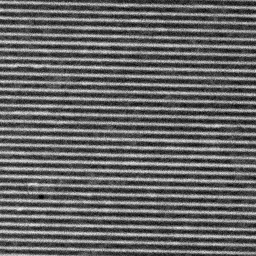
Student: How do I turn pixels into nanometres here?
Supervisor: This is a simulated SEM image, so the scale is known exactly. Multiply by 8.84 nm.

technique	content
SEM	parallel lines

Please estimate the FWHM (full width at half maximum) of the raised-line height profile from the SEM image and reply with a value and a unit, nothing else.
17.7 nanometres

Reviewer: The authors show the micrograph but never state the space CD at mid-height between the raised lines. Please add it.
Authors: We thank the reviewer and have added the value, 53 nanometers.